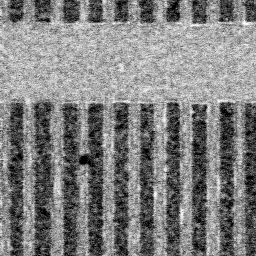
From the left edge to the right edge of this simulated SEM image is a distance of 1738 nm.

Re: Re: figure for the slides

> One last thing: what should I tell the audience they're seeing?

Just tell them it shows parallel lines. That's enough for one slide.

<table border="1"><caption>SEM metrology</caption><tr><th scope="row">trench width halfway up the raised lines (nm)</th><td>61.1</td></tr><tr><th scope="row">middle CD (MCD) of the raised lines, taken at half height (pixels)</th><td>16.3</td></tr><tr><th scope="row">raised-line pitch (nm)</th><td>179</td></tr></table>